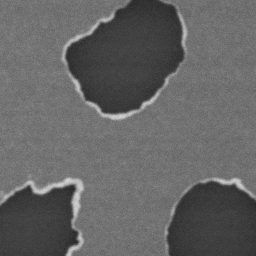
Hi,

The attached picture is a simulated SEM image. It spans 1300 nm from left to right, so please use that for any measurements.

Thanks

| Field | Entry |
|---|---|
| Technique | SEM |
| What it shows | holes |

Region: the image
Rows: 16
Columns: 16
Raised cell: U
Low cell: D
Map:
UUUUUUUUDDDUUUUU
UUUUUUDDDDDUUUUU
UUUUUDDDDDDUUUUU
UUUUDDDDDDDDUUUU
UUUUDDDDDDDUUUUU
UUUUUDDDDDUUUUUU
UUUUUUDDDUUUUUUU
UUUUUUUUUUUUUUUU
UUUUUUUUUUUUUUUU
UUUUUUUUUUUUUUUU
UUUUUUUUUUUUUUUU
UUUUDUUUUUUUDDDU
DDDDDUUUUUUDDDDD
DDDDDUUUUUUDDDDD
DDDDDUUUUUDDDDDD
DDDDDUUUUUDDDDDD